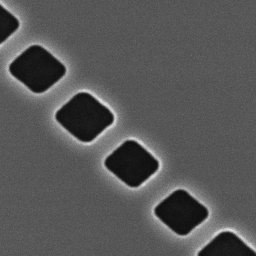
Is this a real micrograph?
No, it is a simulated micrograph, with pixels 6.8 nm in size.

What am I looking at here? holes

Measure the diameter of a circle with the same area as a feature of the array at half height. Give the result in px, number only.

46.9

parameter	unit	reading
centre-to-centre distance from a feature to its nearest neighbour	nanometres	454